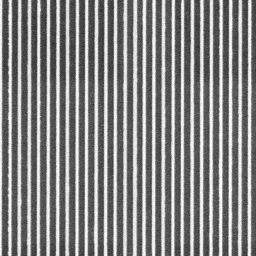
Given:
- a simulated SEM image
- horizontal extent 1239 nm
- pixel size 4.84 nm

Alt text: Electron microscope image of parallel lines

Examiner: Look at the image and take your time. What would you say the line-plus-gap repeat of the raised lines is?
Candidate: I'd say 0.0463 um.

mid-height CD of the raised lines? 13.3 nm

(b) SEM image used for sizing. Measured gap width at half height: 35.1 nm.